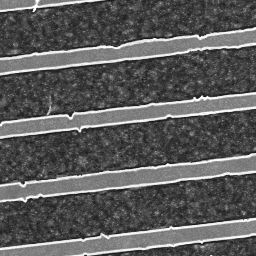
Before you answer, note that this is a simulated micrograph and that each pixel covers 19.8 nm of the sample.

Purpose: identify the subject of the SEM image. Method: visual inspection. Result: one or a few lines or trenches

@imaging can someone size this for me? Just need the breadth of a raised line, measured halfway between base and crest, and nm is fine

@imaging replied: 301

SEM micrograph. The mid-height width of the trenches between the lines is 956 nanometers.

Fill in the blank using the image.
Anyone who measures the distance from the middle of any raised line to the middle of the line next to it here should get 1250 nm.